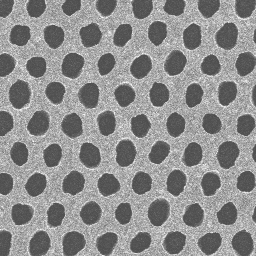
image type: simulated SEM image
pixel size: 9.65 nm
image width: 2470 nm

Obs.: a regular array of holes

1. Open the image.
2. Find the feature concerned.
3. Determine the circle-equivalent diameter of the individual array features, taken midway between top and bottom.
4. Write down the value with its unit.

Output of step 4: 21.3 px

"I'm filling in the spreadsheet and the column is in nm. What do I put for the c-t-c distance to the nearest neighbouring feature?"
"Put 318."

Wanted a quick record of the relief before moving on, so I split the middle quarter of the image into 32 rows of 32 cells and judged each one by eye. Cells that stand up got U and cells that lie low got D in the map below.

DDDDDUUUUDDDDUUUUDDDDDUUUDDDDDUU
DDDDUUUUUDDDUUUUUDDDDDUUUDDDDDUU
DDDDUUUUUDDUUUUUUDDDDUUUUUDDDUUU
UUDUUUUUUUUUUUUUUUDUUUUUUUUUUUUU
UUUUUUUUUUUUUUUUUUUUUUUUUUUUUUUU
UUUUUDDDUUUUUUDDUUUUUUDDDDUUUUUD
UUUUDDDDDUUUUDDDDUUUUUDDDDUUUUDD
UUUUDDDDDUUUUDDDDDUUUDDDDDDUUUDD
UUUUDDDDDUUUUDDDDDUUUUDDDDUUUUDD
UUUUUDDDDUUUUDDDDUUUUUDDDDUUUUDD
UUUUUDDDUUUUUUDDUUUUUUUDUUUUUUUD
UUUUUUUUUUUUUUUUUUUUUUUUUUUUUUUU
UUDUUUUUUUDDDUUUUUUDUUUUUUUDDUUU
DDDDUUUUUDDDDUUUUDDDDUUUUUDDDDUU
DDDDDUUUUDDDDUUUUDDDDUUUUUDDDDDU
DDDDDUUUUDDDDUUUUDDDDDUUUUDDDDUU
DDDDDUUUUDDDDUUUUDDDDUUUUUDDDDUU
UDDDUUUUUDDDUUUUUDDDDUUUUUDDDUUU
UUDUUUUUUUUUUUUUUUUUUUUUUUUUUUUU
UUUUUUUUUUUUUUDDDUUUUUUUUUUUUUUU
UUUUDDDDUUUUUDDDDDUUUUDDDDUUUUUD
UUUUDDDDDUUUUDDDDDUUUUDDDDDUUUDD
UUUUDDDDDUUUUDDDDDUUUDDDDDUUUUDD
UUUUDDDDDUUUUDDDDDUUUDDDDUUUUUDD
UUUUUDDDDUUUUDDDDUUUUUDDUUUUUUDD
UUUUUDDDUUUUUUDDUUUUUUUUUUUUUUUD
UUUUUUUUUUUUUUUUUUUUUUUUUUUUUUUU
UDDDUUUUUUDDUUUUUUDDDUUUUUDDDDUU
DDDDDUUUUDDDDUUUUDDDDDUUUUDDDDDU
DDDDDUUUDDDDDDUUUDDDDDUUUUDDDDDU
DDDDDUUUUDDDDDUUUDDDDDUUUUDDDDUU
DDDDDUUUUDDDDDUUUDDDDDUUUUDDDDUU